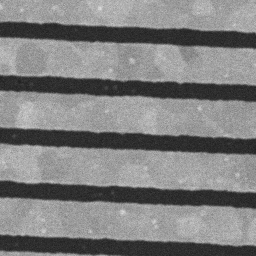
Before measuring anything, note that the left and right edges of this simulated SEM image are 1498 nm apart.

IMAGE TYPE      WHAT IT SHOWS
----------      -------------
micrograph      lines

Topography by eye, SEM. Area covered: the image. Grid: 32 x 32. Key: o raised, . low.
oooooooooooooooooooooooooooooooo
oooooooooooooooooooooooooooooooo
oooooooooooooooooooooooooooooooo
...................ooooooooooooo
................................
ooooooooooooooo.................
oooooooooooooooooooooooooooooooo
oooooooooooooooooooooooooooooooo
oooooooooooooooooooooooooooooooo
.......ooooooooooooooooooooooooo
...............................o
oo..............................
ooooooooooooooooooooooooo.......
oooooooooooooooooooooooooooooooo
oooooooooooooooooooooooooooooooo
oooooooooooooooooooooooooooooooo
............o.oooooooooooooooooo
................................
ooooooooo.......................
oooooooooooooooooooooooooooooooo
oooooooooooooooooooooooooooooooo
oooooooooooooooooooooooooooooooo
.ooooooooooooooooooooooooooooooo
....................oooooooooooo
................................
ooooooooooooooooo...............
oooooooooooooooooooooooooooooooo
oooooooooooooooooooooooooooooooo
oooooooooooooooooooooooooooooooo
.....ooooooooooooooooooooooooooo
...........................ooooo
o...............................